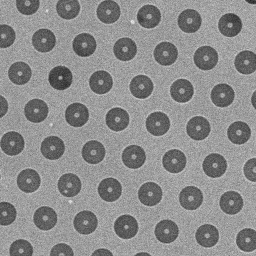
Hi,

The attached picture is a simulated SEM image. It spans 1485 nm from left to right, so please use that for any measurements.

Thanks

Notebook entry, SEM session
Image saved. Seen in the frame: an array of small figures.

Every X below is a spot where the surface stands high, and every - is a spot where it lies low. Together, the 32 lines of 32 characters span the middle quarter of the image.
XXXXXXXXXXXXXXXXXXXXXXXXX-XXXXXX
-XXXXXXXX-XXXXXXXXXXXXXXXXXXXXXX
--XXXXX-----XXXXXXXXXXXXXXXXXXXX
--XXXX------XXXXX-----XXXXXXXXXX
--XXXX---X--XXXXX-----XXXXX-----
--XXXX------XXXX---X--XXXXX-----
XXXXXXX-----XXXX------XXXX---X--
XXXXXXXX--XXXXXXX-----XXXX------
XXXXXXXXXXXXXXXXXX---XXXXXX-----
XXXXXXXXXXXXXXXXXXXXXXXXXXXX---X
X----XXXXXXXXXXXXXXXXXXXXXXXXXXX
------XXXXX----XXXXXXXXXXXXXXXXX
------XXXX------XXXXX-----XXXXXX
------XXXX---X--XXXXX-----XXXXXX
X-----XXXX------XXXX-------XXXX-
XX---XXXXXX-----XXXX-------XXX--
XXXXXXXXXXXX---XXXXXX-----XXXX--
XXXXXXXXXXXXXXXXXXXXXX---XXXXXX-
XXXXXXXXXXXXXXXXXXXXXXXXXXXXXXXX
XXXXXX---XXXXXXXXXXXXXXXXXXXXXXX
XXXXX-----XXXXXX---XXXXXXXXXXXXX
XXXX------XXXXX-----XXXXXX---XXX
XXXX---X---XXX-------XXXX-----XX
XXXXX-----XXXX---X---XXXX------X
XXXXXX---XXXXXX-----XXXX---X---X
XXXXXXXXXXXXXXX-----XXXXX------X
XXXXXXXXXXXXXXXXXXXXXXXXX-----XX
---XXXXXXXXXXXXXXXXXXXXXXXXXXXXX
----XXXXXX---XXXXXXXXXXXXXXXXXXX
----XXXXX-----XXXXXXX-XXXXXXXXXX
-X--XXXXX-----XXXXX-----XXXXXXX-
----XXXX---X---XXXX-----XXXXX---